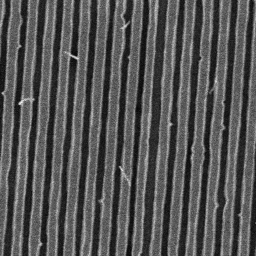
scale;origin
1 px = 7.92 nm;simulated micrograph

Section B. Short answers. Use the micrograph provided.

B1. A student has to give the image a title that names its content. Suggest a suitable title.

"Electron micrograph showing parallel lines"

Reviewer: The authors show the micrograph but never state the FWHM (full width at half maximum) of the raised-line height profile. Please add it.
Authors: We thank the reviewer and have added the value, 73.1 nanometers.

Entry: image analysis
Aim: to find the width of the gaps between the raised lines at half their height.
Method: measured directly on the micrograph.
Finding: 58.3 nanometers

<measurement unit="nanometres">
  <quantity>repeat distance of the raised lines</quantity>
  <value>138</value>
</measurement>